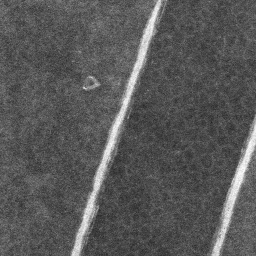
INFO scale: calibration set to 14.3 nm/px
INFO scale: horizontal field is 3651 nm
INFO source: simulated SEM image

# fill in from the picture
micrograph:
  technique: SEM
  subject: one or a few lines or trenches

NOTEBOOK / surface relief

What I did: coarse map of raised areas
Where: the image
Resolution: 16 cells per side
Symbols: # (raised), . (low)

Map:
##########......
#########.......
#########.......
#########.......
########........
########........
########........
#######.........
#######.........
#######.........
######.........#
######.........#
######.........#
#####.........##
#####.........##
#####.........##